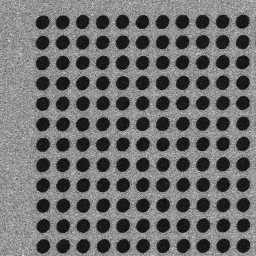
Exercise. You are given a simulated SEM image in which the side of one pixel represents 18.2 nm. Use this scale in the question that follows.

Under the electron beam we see a regular array of holes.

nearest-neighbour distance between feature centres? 361 nm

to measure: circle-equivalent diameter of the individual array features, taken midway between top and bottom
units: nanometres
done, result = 254